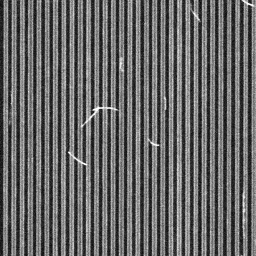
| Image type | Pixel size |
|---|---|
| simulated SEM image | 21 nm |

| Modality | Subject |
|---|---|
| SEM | parallel lines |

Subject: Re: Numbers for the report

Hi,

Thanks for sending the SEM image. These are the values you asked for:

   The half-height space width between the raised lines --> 97.3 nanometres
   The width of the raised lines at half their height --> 78.9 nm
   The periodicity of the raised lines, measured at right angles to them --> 174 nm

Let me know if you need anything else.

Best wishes